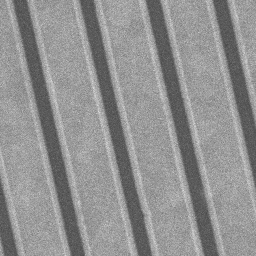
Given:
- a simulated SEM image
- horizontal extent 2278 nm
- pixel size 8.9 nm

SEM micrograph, one or a few lines or trenches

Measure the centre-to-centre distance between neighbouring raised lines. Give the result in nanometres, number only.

578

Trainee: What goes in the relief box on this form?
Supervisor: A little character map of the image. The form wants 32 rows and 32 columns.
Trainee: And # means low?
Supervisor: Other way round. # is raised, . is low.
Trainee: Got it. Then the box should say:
#...######..######...#####...###
#...######...#####...#####...###
##..######...#####...######..###
##...#####...######..######...##
##...#####...######...#####...##
##...######..######...#####...##
###..######...#####...######..##
###...#####...#####...######...#
###...#####...######..######...#
###...######..######...#####...#
###...######...#####...######..#
####..######...#####...######...
####...#####...######..######...
####...######..######...#####...
####...######..######...#####...
#####..######...#####...######..
#####...#####...#####...######..
#####...#####...######..######..
#####...######..######...#####..
######..######...#####...######.
######...#####...#####...######.
######...#####...######..######.
.#####...######..######...#####.
.#####...######...#####...#####.
.######..######...#####...######
.######...#####...######..######
..#####...######..######...#####
..#####...######...#####...#####
..######..######...#####...#####
..######...#####...#####...#####
..######...#####...######..#####
...#####...######..######...####